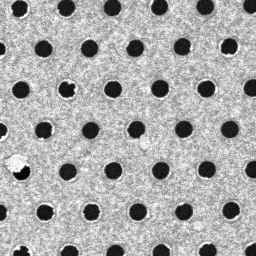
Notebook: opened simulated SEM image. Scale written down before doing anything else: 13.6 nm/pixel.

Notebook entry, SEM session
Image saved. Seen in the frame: a regular array of holes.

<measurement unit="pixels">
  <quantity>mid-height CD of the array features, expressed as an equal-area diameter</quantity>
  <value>18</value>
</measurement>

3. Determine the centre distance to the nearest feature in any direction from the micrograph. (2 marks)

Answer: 629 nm